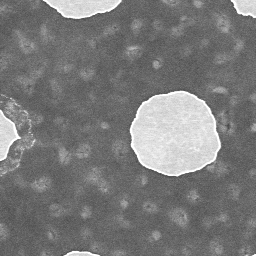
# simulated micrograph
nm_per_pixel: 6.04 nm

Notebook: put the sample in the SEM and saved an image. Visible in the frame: raised bodies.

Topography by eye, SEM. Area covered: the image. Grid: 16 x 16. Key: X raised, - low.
---XXXX--------X
----------------
----------------
----------------
----------------
----------------
---------XXXX---
X-------XXXXX---
X-------XXXXXX--
--------XXXXXX--
---------XXXX---
----------------
----------------
----------------
----------------
----------------